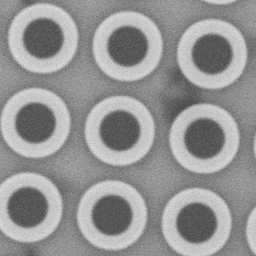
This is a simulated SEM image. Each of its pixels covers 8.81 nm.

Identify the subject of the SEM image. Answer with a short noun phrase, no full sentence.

an array of small figures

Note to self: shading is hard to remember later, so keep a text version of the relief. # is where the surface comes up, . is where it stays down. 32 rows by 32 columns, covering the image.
................................
...#####........................
..#######....######.......#.....
.#########..########....#####...
.#########..########...#######..
.#########..########..#########.
.########...########..#########.
..#######...########..#########.
...#####.....######....#######..
..............####.....#######..
........................#####...
...###..........................
.#######.....####...............
.#######....######......####....
#########..########...#######...
#########..########...#######...
#########..########..#########..
.#######...########..#########..
.######....########..#########..
...###......######....#######...
..............##.......#####....
........................###.....
.#####..........................
#######....######...............
########..########....#####.....
########..########...#######....
########..########..#########...
#######...########..#########..#
#######...########..#########..#
.#####.....######....########..#
............####.....#######...#
......................#####.....